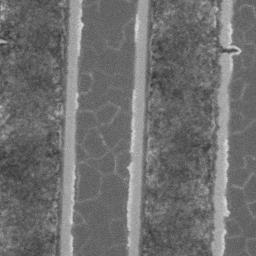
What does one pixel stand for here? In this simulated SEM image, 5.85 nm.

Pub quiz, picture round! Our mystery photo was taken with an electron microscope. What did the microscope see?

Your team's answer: one or a few lines or trenches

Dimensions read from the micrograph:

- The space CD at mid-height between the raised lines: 488 nanometers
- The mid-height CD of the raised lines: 400 nm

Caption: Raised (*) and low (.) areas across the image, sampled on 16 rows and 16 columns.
.....****.....**
.....****.....**
.....****.....**
.....****.....**
....*****.....**
.....****.....**
....*****.....**
....*****.....**
....*****.....**
....*****.....**
....*****.....**
....*****.....**
....****......**
....****......**
....****......**
....****......**